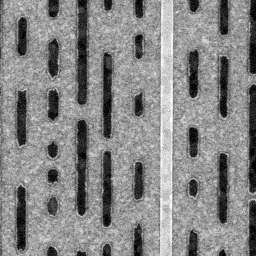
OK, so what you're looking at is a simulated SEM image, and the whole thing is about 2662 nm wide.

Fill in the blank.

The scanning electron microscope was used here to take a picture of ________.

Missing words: parallel lines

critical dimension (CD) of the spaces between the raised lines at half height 185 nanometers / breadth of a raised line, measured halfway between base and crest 108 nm